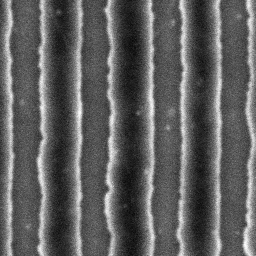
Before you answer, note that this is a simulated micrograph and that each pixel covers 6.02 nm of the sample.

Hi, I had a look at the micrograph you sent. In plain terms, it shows lines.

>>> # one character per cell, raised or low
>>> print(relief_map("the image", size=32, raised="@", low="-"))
@----@@@@@----@@@@@----@@@@----@
@----@@@@@---@@@@@@----@@@@----@
@@---@@@@@----@@@@@----@@@@----@
@----@@@@@----@@@@@----@@@@----@
@----@@@@@----@@@@@----@@@@----@
@----@@@@@----@@@@@----@@@@----@
@----@@@@@----@@@@@----@@@@----@
@----@@@@@----@@@@@----@@@@@---@
@----@@@@@----@@@@@----@@@@@---@
@----@@@@@----@@@@@----@@@@@---@
@----@@@@@----@@@@@----@@@@@---@
@----@@@@@----@@@@@----@@@@----@
@@---@@@@@----@@@@@----@@@@----@
@----@@@@@----@@@@@----@@@@----@
@@---@@@@@----@@@@@----@@@@----@
@@---@@@@@----@@@@@----@@@@@---@
@@---@@@@@----@@@@@----@@@@----@
@@---@@@@@----@@@@@----@@@@-----
@@---@@@@@----@@@@@----@@@@@----
@@---@@@@@----@@@@@----@@@@----@
@@---@@@@@----@@@@@----@@@@----@
@@---@@@@@---@@@@@@----@@@@----@
@@---@@@@@---@@@@@@----@@@@----@
@----@@@@@----@@@@@----@@@@----@
@----@@@@@---@@@@@@----@@@@----@
@----@@@@@---@@@@@@---@@@@@----@
@----@@@@@---@@@@@@---@@@@@----@
@----@@@@@---@@@@@@---@@@@@----@
@----@@@@@----@@@@@---@@@@@----@
@----@@@@@----@@@@@---@@@@@----@
@----@@@@@----@@@@@----@@@@----@
@----@@@@@----@@@@@----@@@@----@